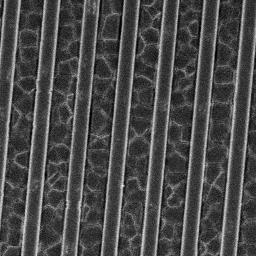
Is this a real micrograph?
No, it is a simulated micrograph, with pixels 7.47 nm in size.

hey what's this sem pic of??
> parallel lines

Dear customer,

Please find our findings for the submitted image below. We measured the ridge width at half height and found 110 nanometres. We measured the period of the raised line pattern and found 296 nm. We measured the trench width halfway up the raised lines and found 0.19 micrometres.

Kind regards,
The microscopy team